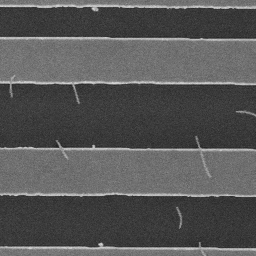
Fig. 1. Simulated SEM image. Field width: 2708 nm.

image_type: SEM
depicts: lines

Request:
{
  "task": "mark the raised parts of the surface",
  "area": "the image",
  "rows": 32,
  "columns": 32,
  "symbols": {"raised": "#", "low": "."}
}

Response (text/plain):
################################
................................
................................
................................
................................
################################
################################
################################
################################
################################
.........#...................###
................................
................................
................................
................................
................................
................................
................................
..##...#........................
################################
################################
################################
################################
################################
.......................###.#.###
................................
................................
................................
................................
................................
................................
################################